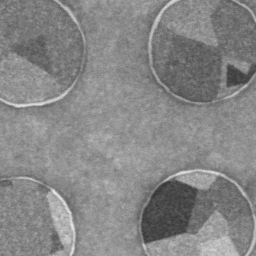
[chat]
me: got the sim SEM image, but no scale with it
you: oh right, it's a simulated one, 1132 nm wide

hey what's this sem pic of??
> raised bodies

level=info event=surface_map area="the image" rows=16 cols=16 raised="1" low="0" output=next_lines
1111000000111110
1111100000111111
1111100001111111
1111100001111111
1111100000111111
1111000000111110
0100000000000000
0000000000000000
0000000000000000
0000000000000000
0000000000000000
1110000000111110
1111000001111110
1111000001111111
1111100001111111
1111100001111111